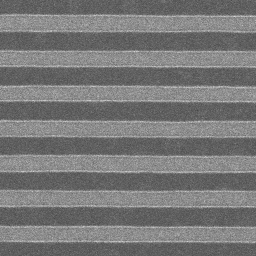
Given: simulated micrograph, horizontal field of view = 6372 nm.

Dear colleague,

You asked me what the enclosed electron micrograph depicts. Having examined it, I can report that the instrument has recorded parallel lines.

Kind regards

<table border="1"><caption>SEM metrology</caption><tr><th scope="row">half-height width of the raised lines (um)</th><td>0.526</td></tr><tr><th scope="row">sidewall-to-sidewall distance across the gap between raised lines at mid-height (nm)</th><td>348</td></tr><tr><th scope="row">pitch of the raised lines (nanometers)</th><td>874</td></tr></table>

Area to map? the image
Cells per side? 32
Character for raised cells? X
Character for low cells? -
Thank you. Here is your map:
XXXXXXXXXXXXXXXXXXXXXXXXXXXXXXXX
XXXXXXXXXXXXXXXXXXXXXXXXXXXXXXXX
--------------------------------
--------------------------------
XXXXXXXXXXXXXXXXXXXXXXXXXXXXXXXX
XXXXXXXXXXXXXXXXXXXXXXXXXXXXXXXX
-------------------------------X
--------------------------------
XXXXXXXXXXXXXXXXXXXXXXXXXXXXXXXX
XXXXXXXXXXXXXXXXXXXXXXXXXXXXXXXX
XXXXXXXXXXXXXXXXXXXXXXXXXXXXXXXX
--------------------------------
--------------------------------
XXXXXXXXXXXXXXXXXXXXXXXXXXXXXXXX
XXXXXXXXXXXXXXXXXXXXXXXXXXXXXXXX
--------------------------------
--------------------------------
XXXXXXXXXXXXXXXXXXXXXXXXXXXXXXXX
XXXXXXXXXXXXXXXXXXXXXXXXXXXXXXXX
-----------XXXXXXXXXXXXXXXXXXXXX
--------------------------------
XXXXXXXXXXXXXXXXXXXX---X--------
XXXXXXXXXXXXXXXXXXXXXXXXXXXXXXXX
XXXXXXXXXXXXXXXXXXXXXXXXXXXXXXXX
--------------------------------
--------------------------------
XXXXXXXXXXXXXXXXXXXXXXXXXXXXXXXX
XXXXXXXXXXXXXXXXXXXXXXXXXX-XXXXX
--------------------------------
--------------------------------
XXXXXXXXXXXXXXXXXXXXXXXXXXXXXXXX
XXXXXXXXXXXXXXXXXXXXXXXXXXXXXXXX